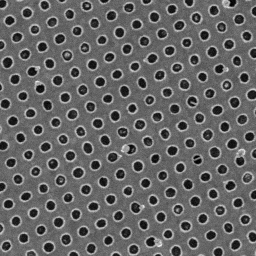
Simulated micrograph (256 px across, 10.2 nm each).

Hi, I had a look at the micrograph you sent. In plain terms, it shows a regular array of holes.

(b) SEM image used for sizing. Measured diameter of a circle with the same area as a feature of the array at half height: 105 nanometers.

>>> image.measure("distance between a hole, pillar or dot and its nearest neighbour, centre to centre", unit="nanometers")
187